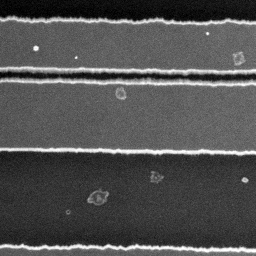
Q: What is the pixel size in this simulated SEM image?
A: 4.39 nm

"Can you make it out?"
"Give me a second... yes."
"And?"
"lines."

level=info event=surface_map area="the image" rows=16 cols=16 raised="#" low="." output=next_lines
................
################
################
################
################
################
################
################
################
..............##
................
................
................
................
................
#######.##......